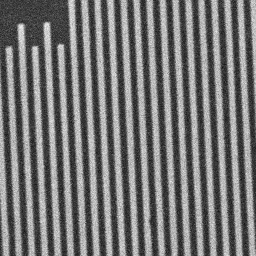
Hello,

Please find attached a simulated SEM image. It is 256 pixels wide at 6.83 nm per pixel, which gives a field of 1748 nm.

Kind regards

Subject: parallel lines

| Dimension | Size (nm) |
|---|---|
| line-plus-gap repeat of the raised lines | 88.4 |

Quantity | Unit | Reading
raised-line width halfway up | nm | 34.9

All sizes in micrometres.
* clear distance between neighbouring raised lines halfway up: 0.0537